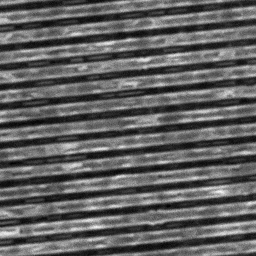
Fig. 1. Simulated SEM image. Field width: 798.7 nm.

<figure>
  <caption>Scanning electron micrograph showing parallel lines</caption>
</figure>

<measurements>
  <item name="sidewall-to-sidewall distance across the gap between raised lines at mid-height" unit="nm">26.4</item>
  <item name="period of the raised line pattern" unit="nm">60.5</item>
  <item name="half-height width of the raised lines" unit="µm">0.0349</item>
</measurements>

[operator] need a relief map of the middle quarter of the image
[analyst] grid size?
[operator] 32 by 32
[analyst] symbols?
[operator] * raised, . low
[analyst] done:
************************........
**************..................
****.......................*****
.................***************
.......*************************
***********************.........
**************..................
****......................******
.................***************
.......*************************
*********************...........
***********.....................
***......................*******
..............******************
....**************************..
********************............
**********......................
*......................*********
.............*******************
....*************************...
********************............
**********......................
......................**********
.............*******************
...**************************...
*******************.............
*********....................***
....................************
..........**********************
**************************......
****************................
*******......................***